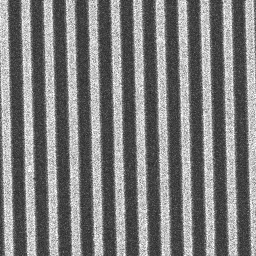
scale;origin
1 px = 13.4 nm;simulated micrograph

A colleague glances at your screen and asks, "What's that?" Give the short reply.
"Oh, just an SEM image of parallel lines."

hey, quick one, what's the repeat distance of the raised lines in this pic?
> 299 nm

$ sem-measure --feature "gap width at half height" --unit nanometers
169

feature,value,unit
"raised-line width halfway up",0.13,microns